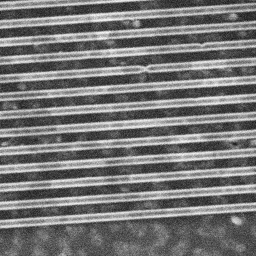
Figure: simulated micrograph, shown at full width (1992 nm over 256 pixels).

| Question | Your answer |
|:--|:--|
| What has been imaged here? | parallel lines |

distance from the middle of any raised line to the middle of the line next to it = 141 nm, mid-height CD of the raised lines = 54.3 nm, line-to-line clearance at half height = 88.3 nm